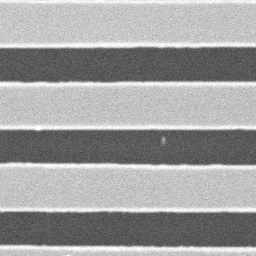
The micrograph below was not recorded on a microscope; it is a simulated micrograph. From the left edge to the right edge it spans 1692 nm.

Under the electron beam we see lines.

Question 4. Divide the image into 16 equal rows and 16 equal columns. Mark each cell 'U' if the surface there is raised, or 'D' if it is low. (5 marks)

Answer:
UUUUUUUUUUUUUUUU
UUUUUUUUUUUUUUUU
UUUUUUUUUUUUUUUU
DDDDDDDDDDDDDDDD
DDDDDDDDDDDDDDDD
UUUUUUUUUUUUUUUU
UUUUUUUUUUUUUUUU
UUUUUUUUUUUUUUUU
DDDDDDDDDDDDDDDD
DDDDDDDDDDDDDDDD
UUUUUUUUUUUUUUUU
UUUUUUUUUUUUUUUU
UUUUUUUUUUUUUUUU
DDDDDDDDDDDDDDDD
DDDDDDDDDDDDDDDD
UUUUUUUUUUUUUUUU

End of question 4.